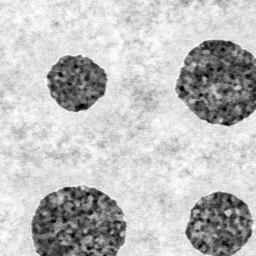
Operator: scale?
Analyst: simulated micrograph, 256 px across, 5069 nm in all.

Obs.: raised bodies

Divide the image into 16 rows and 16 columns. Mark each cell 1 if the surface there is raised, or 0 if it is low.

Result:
0000000000000000
0000000000000000
0000000000000100
0000100000001111
0001111000011111
0001111000011111
0000110000011111
0000000000000110
0000000000000000
0000000000000000
0000000000000000
0000000000000000
0001111000001110
0011111100001111
0011111100001111
0011111100001110